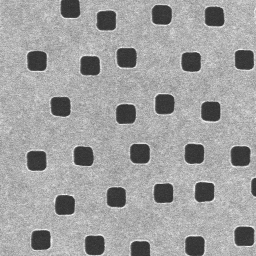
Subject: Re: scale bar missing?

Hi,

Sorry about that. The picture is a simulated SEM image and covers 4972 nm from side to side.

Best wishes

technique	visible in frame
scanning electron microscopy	a regular array of holes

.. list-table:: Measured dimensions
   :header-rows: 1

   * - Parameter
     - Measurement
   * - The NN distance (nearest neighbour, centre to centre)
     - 896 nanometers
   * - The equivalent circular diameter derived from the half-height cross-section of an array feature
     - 416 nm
